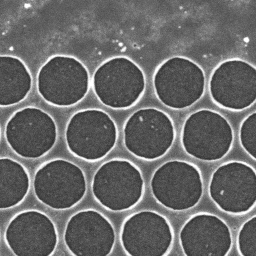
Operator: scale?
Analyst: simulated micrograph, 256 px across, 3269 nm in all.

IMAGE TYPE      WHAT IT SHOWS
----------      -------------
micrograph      a regular array of holes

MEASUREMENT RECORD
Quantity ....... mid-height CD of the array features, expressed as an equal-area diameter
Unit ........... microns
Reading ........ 0.642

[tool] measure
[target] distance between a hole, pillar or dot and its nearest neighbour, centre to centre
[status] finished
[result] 739 nanometers